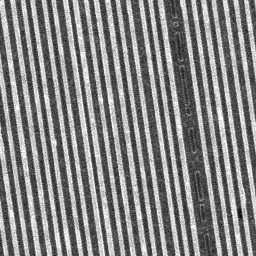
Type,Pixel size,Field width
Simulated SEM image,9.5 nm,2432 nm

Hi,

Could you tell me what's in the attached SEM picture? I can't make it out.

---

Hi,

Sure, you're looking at parallel lines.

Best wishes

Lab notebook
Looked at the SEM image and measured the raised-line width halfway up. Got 36.4 nm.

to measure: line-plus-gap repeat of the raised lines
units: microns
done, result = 0.1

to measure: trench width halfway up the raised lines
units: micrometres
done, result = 0.0623